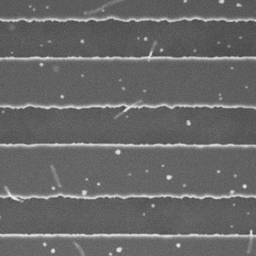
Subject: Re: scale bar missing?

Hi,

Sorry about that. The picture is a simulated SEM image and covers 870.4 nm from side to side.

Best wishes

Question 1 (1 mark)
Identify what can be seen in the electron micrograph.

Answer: lines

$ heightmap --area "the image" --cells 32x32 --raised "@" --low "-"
@@@@@@@@@@@@@@@@@@@@@@@@@@@@@@@@
@@@@@@@@@@@@@@@@@@@@@@@@@@@@@@@@
@@@@@@@@@@@@@--@@@@@@@@--@@@@@@@
--------------------------------
--------------------------------
--------------------------------
--------------------------------
@@@@@@@@@@@@@@@@@@@@@@@@@@@@@@@@
@@@@@@@@@@@@@@@@@@@@@@@@@@@@@@@@
@@@@@@@@@@@@@@@@@@@@@@@@@@@@@@@@
@@@@@@@@@@@@@@@@@@@@@@@@@@@@@@@@
@@@@@@@@@@@@@@@@@@@@@@@@@@@@@@@@
@@@@@@@@@@@@@@@@@@@@@@@@@@@@@@@@
--@--@-@-@@--------------------@
--------------------------------
--------------------------------
--------------------------------
--------------------------------
@@@@@@@@@@@@@@@@@@@@@@@@@@@@@@@@
@@@@@@@@@@@@@@@@@@@@@@@@@@@@@@@@
@@@@@@@@@@@@@@@@@@@@@@@@@@@@@@@@
@@@@@@@@@@@@@@@@@@@@@@@@@@@@@@@@
@@@@@@@@@@@@@@@@@@@@@@@@@@@@@@@@
@@@@@@@@@@@@@@@@@@@@@@@@@@@@@@@@
@@@@@@@-@@@@@@@@@@@@@@@@@@@@@@@@
--------------------------------
--------------------------------
--------------------------------
--------------------------------
@@@@@@@@@@@@@@@@@@@@@@@@@@@@@@@@
@@@@@@@@@@@@@@@@@@@@@@@@@@@@@@@@
@@@@@@@@@@@@@@@@@@@@@@@@@@@@@@@@